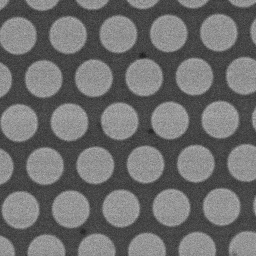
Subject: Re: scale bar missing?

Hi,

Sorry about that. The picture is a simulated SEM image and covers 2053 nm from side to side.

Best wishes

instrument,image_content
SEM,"an array of small figures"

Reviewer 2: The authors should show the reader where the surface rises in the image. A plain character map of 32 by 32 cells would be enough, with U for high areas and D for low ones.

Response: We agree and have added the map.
UDDDUUUDDDUUUDDDUUUDDDDUUUDDDUUU
DDDDDDDDDDDDDDDDDDDDDDDDDDDDDDDD
DUUDDDDUUUDDDUUUDDDDUUUDDDUUUDDD
UUUUDDUUUUUDDUUUUDDUUUUDDUUUUUDU
UUUUDDUUUUUDDUUUUDDUUUUDDUUUUUDU
UUUUDDDUUUDDDUUUUDDUUUUDDDUUUDDD
DUUDDDDDUDDDDDUDDDDDDDDDDDDDDDDD
DDDDDDDDDDDDDDDDDUUDDDDUUDDDDUUU
UDDDUUUDDDUUUUDDUUUUDDUUUUDDUUUU
UDDUUUUUDUUUUUDDUUUUDDUUUUUDUUUU
UDDUUUUUDDUUUUDDUUUUDDUUUUDDDUUU
UDDDUUUDDDUUUDDDDUUDDDDUUUDDDDUU
DDDDDDDDDDDDDDDDDDDDDDDDDDDDDDDD
DUUUDDDUUUDDDUUUDDDDUUUDDDUUUDDD
UUUUDDDUUUUDDUUUUDDUUUUDDUUUUUDD
UUUUUDUUUUUDDUUUUDDUUUUUDUUUUUDD
UUUUDDDUUUUDDUUUUDDDUUUDDDUUUDDD
DUUDDDDDUDDDDDDDDDDDDDDDDDDDDDDD
DDDDDDDDDDDUUDDDDUUDDDDUUUDDDDUU
UDDDUUUUDDUUUUDDUUUUDDUUUUDDDUUU
UUDUUUUUDDUUUUDDUUUUDDUUUUUDDUUU
UUDUUUUUDDUUUUDDUUUUDDUUUUUDDUUU
UDDDUUUDDDDUUDDDDUUDDDDDUDDDDDUD
DDDDDDDDDDDDDDDDDDDDDDDDDDDDDDDD
DUUUDDDUUUDDDUUUUDDDUUUDDDUUUDDD
UUUUUDDUUUUDDUUUUDDUUUUUDUUUUUDD
UUUUUDDUUUUDDUUUUDDUUUUUDDUUUUDD
DUUUDDDUUUUDDUUUUDDDUUUDDDUUUDDD
DDUDDDDDDDDDDDDDDDDDDDDDDDDDDDDD
DDDDDUUDDDDUUDDDDUUUDDDUUUDDDDUU
UDDDUUUUDDUUUUDDUUUUDDDUUUUDDUUU
UUDDUUUUDDUUUUDDUUUUUDUUUUUDDUUU